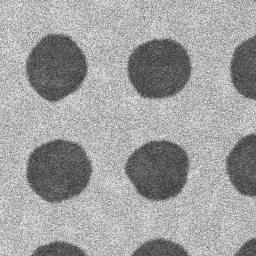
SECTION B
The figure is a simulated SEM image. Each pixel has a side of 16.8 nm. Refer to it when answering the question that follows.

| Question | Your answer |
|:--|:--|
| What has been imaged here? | holes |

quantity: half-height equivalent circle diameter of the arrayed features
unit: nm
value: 1060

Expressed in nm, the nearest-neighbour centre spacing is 1690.